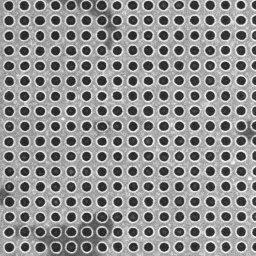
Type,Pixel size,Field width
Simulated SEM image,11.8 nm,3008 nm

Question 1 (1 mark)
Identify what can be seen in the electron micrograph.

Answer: a regular array of holes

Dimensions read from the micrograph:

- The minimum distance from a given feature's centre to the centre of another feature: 14.9 px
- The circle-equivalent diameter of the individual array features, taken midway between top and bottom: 118 nanometers